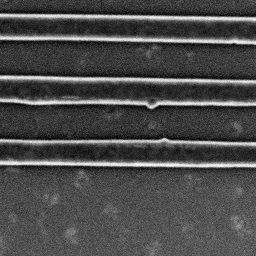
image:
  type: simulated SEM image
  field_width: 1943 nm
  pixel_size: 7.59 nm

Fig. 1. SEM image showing one or a few lines or trenches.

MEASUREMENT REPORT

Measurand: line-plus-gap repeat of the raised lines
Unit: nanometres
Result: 473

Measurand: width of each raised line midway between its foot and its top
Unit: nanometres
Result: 177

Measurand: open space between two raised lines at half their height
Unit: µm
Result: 0.295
